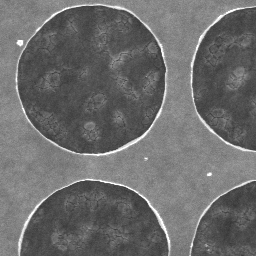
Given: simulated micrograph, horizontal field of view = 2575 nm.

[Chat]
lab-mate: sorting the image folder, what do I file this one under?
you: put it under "holes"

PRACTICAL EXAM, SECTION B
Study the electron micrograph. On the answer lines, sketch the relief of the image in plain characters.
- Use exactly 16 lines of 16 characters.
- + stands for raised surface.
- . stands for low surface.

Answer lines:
+++++..++++++++.
+++......++++...
++........+++...
+.........++....
+.........++....
+.........++....
+.........++....
++........+++...
+++......+++++..
+++++..+++++++++
++++++++++++++++
+++++..++++++++.
+++......+++++..
++........+++...
+.........++....
+..........+....